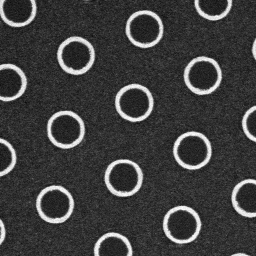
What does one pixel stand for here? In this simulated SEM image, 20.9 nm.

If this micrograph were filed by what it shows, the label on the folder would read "a regular array of raised bodies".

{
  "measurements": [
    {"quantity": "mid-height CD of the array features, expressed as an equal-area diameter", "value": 718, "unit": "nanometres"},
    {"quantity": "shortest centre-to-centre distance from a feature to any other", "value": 1540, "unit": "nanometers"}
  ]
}